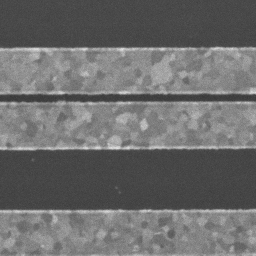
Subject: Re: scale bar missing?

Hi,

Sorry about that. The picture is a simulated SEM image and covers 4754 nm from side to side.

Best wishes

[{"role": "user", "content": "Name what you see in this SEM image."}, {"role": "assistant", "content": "lines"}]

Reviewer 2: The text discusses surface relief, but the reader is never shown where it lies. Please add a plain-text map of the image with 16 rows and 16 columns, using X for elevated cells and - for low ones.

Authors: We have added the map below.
----------------
----------------
----------------
XXXXXXXXXXXXXXXX
XXXXXXXXXXXXXXXX
XXXXXXXXXXXXXXXX
XXXXXXXXXXXXXXXX
XXXXXXXXXXXXXXXX
XXXXXXXXXXXXXXXX
----------------
----------------
----------------
----------------
XXXXXXXXXXXXXXXX
XXXXXXXXXXXXXXXX
XXXXXXXXXXXXXXXX